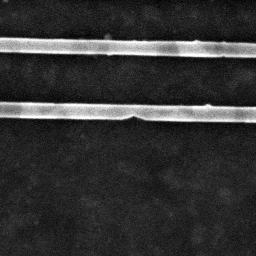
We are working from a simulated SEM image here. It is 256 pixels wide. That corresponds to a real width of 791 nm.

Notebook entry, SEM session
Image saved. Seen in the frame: one or a few lines or trenches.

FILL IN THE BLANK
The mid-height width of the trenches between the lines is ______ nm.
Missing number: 158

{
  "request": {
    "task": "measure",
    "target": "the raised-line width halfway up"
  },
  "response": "14 pixels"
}